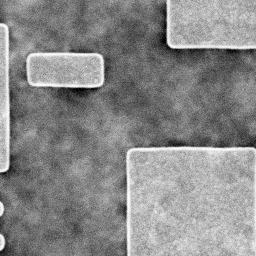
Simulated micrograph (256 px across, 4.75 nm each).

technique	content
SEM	wiring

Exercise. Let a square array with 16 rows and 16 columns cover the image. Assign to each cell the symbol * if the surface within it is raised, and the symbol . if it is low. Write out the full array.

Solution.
..........******
..........******
..........******
..****..........
..****..........
*...............
*...............
*...............
*...............
*.......********
........********
........********
........********
........********
........********
........********